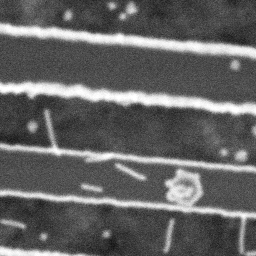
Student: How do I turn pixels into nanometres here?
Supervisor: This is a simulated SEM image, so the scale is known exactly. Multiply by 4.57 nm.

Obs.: lines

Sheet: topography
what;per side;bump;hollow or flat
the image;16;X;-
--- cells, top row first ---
----------------
----------------
XXXXXXXXX-------
XXXXXXXXXXXXXXXX
XXXXXXXXXXXXXXXX
XXXXXXXXXXXXXXXX
------------XXXX
----------------
----------------
XXXXX-----------
XXXXXXXXXXXXXXXX
XXXXXXXXXXXXXXXX
----XXXXXXXXXXXX
---------------X
----------------
----------------